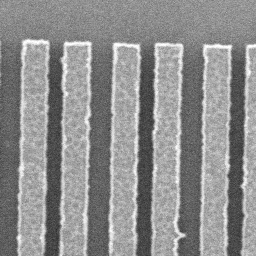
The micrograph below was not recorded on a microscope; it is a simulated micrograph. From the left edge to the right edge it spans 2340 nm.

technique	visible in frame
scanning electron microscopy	parallel lines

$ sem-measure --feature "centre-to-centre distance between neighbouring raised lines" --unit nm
416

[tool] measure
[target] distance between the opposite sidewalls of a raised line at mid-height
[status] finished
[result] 25.2 px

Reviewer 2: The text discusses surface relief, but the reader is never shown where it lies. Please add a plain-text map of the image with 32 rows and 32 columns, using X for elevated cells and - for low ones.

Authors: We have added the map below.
--------------------------------
--------------------------------
--------------------------------
--------------------------------
--------------------------------
---XXX---XX---------------------
---XXX--XXX---XXX--XXXX---XXX--X
---XXX--XXX---XXX---XXX---XXX--X
---XXX--XXX---XXX--XXXX---XXX--X
---XXX--XXX---XXX--XXXX---XXX--X
---XXX--XXX---XXX--XXXX---XXX--X
---XXX--XXX---XXX--XXXX---XXX--X
---XXX--XXX---XXX--XXX----XXX--X
---XXX--XXX---XXX--XXX----XXX--X
---XXX--XXX---XXX--XXX---XXXX--X
---XXX--XXX---XXX--XXX---XXXX--X
---XXX--XXX---XXX--XXXX--XXXX--X
---XXX--XXX---XXX--XXX---XXXX--X
---XXX--XXX---XXX--XXX---XXXX--X
---XXX--XXX---XXX--XXX---XXXX--X
---XXX--XXX---XXX--XXX---XXXX--X
--XXXX--XXX---XXX--XXX---XXXX--X
---XXX--XXX---XXX--XXX---XXX--XX
---XXX--XXX---XXX--XXX---XXX--XX
--XXXX--XXX---XXX--XXX---XXX---X
--XXXX--XXX---XXX--XXX---XXX---X
--XXXX--XXX---XXX--XXX---XXX---X
--XXXX--XXX---XXX--XXX---XXX--XX
--XXXX--XXX---XXX--XXX---XXX--XX
--XXXX--XXX---XXX--XXXX--XXX--XX
--XXXX--XXX---XXX--XXX---XXX--XX
--XXX---XXX---XXX--XXX---XXX--XX